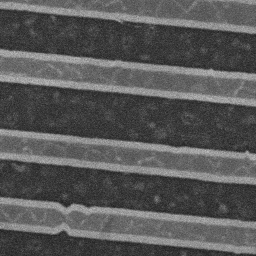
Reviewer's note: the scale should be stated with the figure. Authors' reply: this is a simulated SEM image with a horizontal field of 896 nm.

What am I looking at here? one or a few lines or trenches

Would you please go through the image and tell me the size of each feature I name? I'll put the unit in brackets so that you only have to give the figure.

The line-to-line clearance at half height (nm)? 164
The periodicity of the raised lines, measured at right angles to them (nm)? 257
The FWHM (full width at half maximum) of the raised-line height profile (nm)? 87.4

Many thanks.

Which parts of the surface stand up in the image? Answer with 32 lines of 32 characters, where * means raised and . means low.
********************************
.........***********************
...................*************
.............................***
................................
................................
................................
*********.......................
*******************.............
******************************..
.........***********************
..................**************
.............................***
................................
................................
................................
................................
**********......................
********************............
.******************************.
...........*********************
.....................***********
..............................**
................................
................................
****............................
***************.................
*************************.......
...*****************************
..............******************
........................********
................................